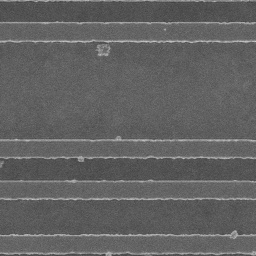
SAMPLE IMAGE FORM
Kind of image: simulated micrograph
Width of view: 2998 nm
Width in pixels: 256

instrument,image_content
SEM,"lines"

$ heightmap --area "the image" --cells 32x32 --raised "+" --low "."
................................
................................
................................
++++++++++++++++++++++++++++++++
++++++++++++++++++++++++++++++++
................................
................................
................................
................................
................................
................................
................................
................................
................................
................................
................................
................................
..+.............................
++++++++++++++++++++++++++++++++
++++++++++++++++++++++++++++++++
................................
................................
................................
++++++++++++++++++++++++++++++++
++++++++++++++++++++++++++++++++
................................
................................
................................
................................
++++++++++++++++++++++++++++++++
++++++++++++++++++++++++++++++++
++++++++++++++++++++++++++++++++